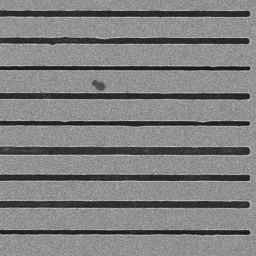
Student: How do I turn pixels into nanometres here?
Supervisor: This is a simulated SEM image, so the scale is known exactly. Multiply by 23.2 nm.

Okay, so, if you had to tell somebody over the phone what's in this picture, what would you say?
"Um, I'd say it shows parallel lines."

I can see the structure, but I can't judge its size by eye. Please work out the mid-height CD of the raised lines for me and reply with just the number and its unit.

0.502 um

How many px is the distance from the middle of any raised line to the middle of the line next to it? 27.4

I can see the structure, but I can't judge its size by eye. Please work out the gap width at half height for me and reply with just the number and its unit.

142 nanometers